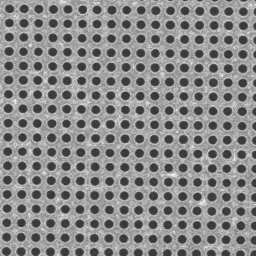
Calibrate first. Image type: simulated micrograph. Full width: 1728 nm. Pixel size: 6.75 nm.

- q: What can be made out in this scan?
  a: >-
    a regular array of holes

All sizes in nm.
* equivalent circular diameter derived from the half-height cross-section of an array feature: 58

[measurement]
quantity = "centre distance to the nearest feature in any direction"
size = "94.5 nanometers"